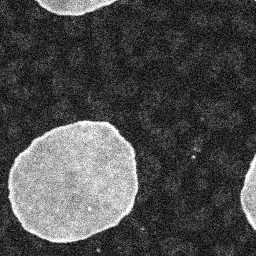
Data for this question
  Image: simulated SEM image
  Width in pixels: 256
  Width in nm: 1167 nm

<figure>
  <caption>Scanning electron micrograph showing raised bodies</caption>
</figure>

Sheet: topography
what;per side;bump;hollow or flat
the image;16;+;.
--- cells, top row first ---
...+++..........
................
................
................
................
................
................
................
...+++++........
..++++++........
.+++++++........
.++++++++......+
.+++++++.......+
.+++++++.......+
..++++..........
................